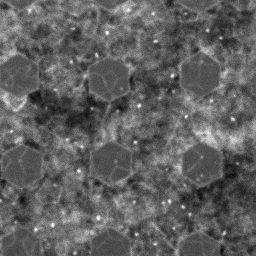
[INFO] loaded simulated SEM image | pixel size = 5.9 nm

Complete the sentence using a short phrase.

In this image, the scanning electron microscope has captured raised bodies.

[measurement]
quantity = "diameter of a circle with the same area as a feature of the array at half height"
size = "253 nm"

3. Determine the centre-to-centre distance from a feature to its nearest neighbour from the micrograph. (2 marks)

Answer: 526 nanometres